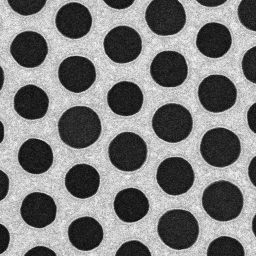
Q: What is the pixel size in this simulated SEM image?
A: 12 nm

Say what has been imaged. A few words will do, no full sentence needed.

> a regular array of holes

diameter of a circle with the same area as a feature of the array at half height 37.3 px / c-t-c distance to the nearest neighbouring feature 0.633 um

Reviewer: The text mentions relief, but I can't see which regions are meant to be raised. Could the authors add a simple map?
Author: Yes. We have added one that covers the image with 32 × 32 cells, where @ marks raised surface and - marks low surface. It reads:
@-----@@--@@@---@@@----@@---@@--
@@---@@----@@@@@@@-----@@@@@@@--
@@@@@@@----@@@@@@@-----@@@@@@@--
@@@@@@@----@@@--@@@----@@---@@@-
@@---@@@--@@@----@@@@@@@@----@@@
@-----@@@@@@@-----@@@@@@@----@@@
@-----@@@@@@@-----@@--@@@---@@@-
@@----@@---@@@---@@----@@@@@@@--
@@@@@@@-----@@@@@@@----@@@@@@@--
@@@@@@@-----@@@@@@@----@@@--@@@-
@@@@@@@@----@@@--@@@---@@----@@@
@@----@@@-@@@@----@@@@@@@-----@@
@@----@@@@@@@-----@@@@@@@----@@@
@@----@@@--@@@----@@---@@@---@@-
@@@--@@@----@@@@@@@-----@@@@@@@-
@@@@@@@------@@@@@@-----@@@@@@@-
-@@@@@@------@@@@@@-----@@---@@@
@@@--@@@----@@----@@---@@-----@@
@@@---@@@--@@@----@@@@@@@-----@@
@@-----@@@@@@@----@@@@@@@-----@@
@@----@@@@@@@@----@@----@@---@@-
@@@--@@@----@@@@@@@@----@@@@@@@-
-@@@@@@@----@@@@@@@@----@@@@@@@-
-@@@@@@@----@@@@@@@@----@@----@@
-@@---@@@--@@@@---@@@@@@@-----@@
@@@----@@@@@@@-----@@@@@@-----@@
@@@----@@@@@@@----@@@---@@----@@
@@@----@@---@@@--@@@-----@@--@@@
-@@@@@@@@----@@@@@@@-----@@@@@@@
-@@@@@@@@----@@@@@@@-----@@@@@@@
-@@@@@@@@---@@@---@@@---@@----@@
@@@----@@@@@@@@----@@@@@@@-----@